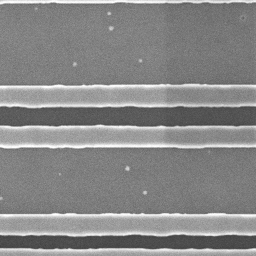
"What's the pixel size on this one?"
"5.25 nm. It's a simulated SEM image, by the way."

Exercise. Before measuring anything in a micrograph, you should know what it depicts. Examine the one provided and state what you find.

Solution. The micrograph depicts lines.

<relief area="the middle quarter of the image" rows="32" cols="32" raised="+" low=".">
................................
................................
................................
................................
................................
.......+++.+++++++++++++++++++++
++++++++++++++++++++++++++++++++
++++++++++++++++++++++++++++++++
++++++++++++++++++++++++++++++++
++++++++++++++++++++++++++++++++
..++.+.+++.........+++++..++....
................................
................................
................................
................................
........++......................
++++++++++++++++++++++++++++++++
++++++++++++++++++++++++++++++++
++++++++++++++++++++++++++++++++
++++++++++++++++++++++++++++++++
+++++++++++++.+.++++++++++++++++
................................
................................
................................
................................
................................
................................
................................
................................
................................
................................
................................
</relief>